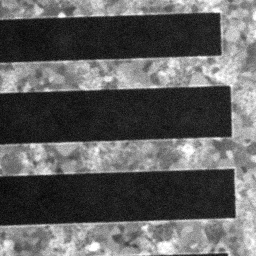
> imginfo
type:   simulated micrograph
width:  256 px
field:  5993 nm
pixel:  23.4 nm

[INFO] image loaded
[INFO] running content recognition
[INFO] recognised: one or a few lines or trenches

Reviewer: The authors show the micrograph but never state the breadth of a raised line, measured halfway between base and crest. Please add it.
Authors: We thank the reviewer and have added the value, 702 nm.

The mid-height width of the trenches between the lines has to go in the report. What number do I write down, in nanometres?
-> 1180